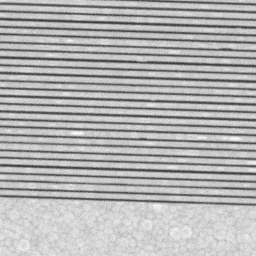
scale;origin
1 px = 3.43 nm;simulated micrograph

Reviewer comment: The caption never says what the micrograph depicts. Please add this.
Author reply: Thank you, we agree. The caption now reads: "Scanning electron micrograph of parallel lines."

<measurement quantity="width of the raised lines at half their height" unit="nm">18.9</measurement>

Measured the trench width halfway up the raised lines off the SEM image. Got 6.4 nm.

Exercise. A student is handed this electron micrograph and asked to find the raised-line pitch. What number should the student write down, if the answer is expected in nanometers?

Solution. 26.4